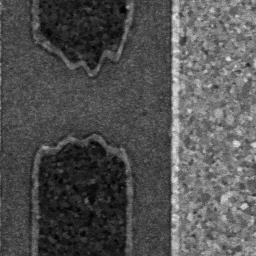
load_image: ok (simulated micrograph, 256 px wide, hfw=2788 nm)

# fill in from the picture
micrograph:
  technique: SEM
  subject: one or a few lines or trenches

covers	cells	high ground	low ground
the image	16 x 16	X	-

--XXXXXX---XXXXX
--XXXXXX---XXXXX
---XXXXX---XXXXX
----XXX----XXXXX
-----------XXXXX
-----------XXXXX
-----------XXXXX
-----------XXXXX
-----------XXXXX
---XXXX----XXXXX
--XXXXXX---XXXXX
--XXXXXX---XXXXX
--XXXXXX---XXXXX
--XXXXXX---XXXXX
--XXXXXX---XXXXX
--XXXXXX---XXXXX